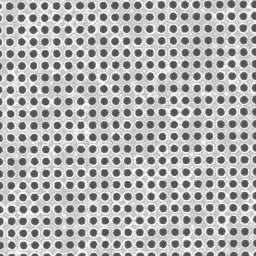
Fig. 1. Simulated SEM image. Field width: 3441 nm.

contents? a regular array of holes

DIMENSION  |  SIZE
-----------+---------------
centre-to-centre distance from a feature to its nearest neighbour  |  155 nm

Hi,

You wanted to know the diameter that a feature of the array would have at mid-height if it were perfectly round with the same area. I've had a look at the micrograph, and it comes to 103 nm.